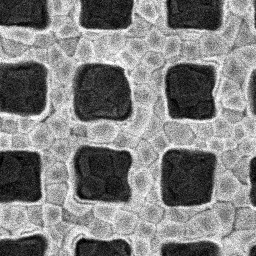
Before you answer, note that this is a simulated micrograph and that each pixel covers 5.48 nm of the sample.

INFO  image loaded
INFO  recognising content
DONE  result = holes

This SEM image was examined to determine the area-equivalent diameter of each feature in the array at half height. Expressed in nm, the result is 328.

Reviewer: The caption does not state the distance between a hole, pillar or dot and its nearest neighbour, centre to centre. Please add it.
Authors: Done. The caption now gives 452 nm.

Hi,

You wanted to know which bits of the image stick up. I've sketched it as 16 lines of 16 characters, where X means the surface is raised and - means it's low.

---XX---XX----XX
---XX---XXX---XX
XXXXXXXXXXXXXXXX
XXXXXXXXXXXXXXXX
---XX---XXX--XXX
---XX---XX---XXX
---XX---XX---XXX
XXXXX-X-XXXXXXXX
XXXXXXXXXXXXXXXX
--XXX---XXX-XXXX
---XX---XX---XXX
---XX---XX---XXX
--XXX---XX---XXX
XXXXXXXXXXXXXXXX
XXXXXXXXXXXXXXXX
---XX---XX---XXX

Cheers